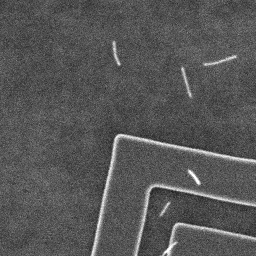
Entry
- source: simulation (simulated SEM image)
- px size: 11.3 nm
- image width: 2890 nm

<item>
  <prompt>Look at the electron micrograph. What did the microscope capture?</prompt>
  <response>groups of lines, slits or small figures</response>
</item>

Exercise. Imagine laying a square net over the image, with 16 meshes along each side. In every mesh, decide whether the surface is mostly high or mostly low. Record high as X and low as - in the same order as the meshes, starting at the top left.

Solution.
----------------
----------------
----------------
----------------
----------------
----------------
----------------
----------------
----------------
-------XXXXXX---
-------XXXXXXXXX
-------XXXXXXXXX
------XXX-----XX
------XXX-------
------XXX--XXX--
------XXX--XXXXX